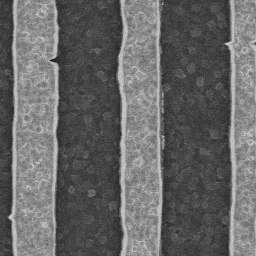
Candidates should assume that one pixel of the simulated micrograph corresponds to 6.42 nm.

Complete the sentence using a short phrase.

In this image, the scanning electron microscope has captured one or a few lines or trenches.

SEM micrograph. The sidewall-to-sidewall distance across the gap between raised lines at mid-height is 455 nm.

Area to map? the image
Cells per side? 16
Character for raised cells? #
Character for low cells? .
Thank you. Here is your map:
.##.....##....##
.##.....##.....#
.###....##....##
.##.....##....##
.###....##.....#
.###....##.....#
.###....##.....#
.##.....##.....#
.##.....##.....#
.##.....##.....#
.##.....##.....#
.##.....##.....#
.##.....##.....#
.##.....##....##
.##.....##....##
.##.....##....##